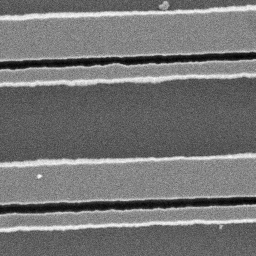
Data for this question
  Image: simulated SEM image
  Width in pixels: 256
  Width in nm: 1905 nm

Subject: lines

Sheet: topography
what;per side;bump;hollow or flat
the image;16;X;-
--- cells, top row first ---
----------------
XXXXXXXXXXXXXXXX
XXXXXXXXXXXXXXXX
XXXXXXXXXXXXXXXX
XXXXXXXXXXXXXXXX
----------------
----------------
----------------
----------------
----------------
XXXXXXXXXXXXXXXX
XXXXXXXXXXXXXXXX
XXXXXXXXXXXXXXXX
XXXXXXXXXXXXXXXX
----------------
----------------